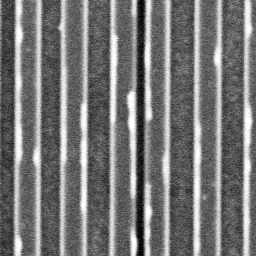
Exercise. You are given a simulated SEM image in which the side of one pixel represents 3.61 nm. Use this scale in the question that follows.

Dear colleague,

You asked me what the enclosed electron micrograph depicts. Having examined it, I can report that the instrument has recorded parallel lines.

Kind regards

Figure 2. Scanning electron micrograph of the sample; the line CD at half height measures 87.5 nanometres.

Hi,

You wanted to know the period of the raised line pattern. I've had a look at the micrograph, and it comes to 162 nm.